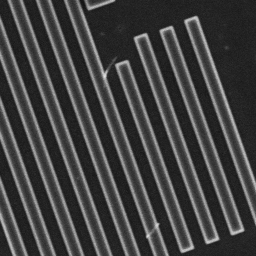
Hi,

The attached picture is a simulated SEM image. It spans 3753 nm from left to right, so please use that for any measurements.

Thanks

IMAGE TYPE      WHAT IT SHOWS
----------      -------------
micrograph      groups of lines, slits or small figures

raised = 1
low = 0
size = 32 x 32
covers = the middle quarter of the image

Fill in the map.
11000011100001110000111000011100
11100011110001110000111100011110
11100001110000111000011100001110
11100001110000111000011100001110
11100001111000111100001110000111
01110000111000011100001110000111
01110000111000011100001110000111
01111000011100001110000111000011
00111000011100001110000111000011
00111000011100001111000111000011
00011100001110000111000011100001
00011100001110000111000011100001
00011100001110000111000011110001
00001110000111000011100001110000
00001110000111000011100001110000
00001110000111000011110000111000
10000111000011100001110000111000
10000111000011100001110000111000
10000111000001110000111000011100
11000011100001110000111000011100
11000011100001110000111000011100
11100011110001110000111100011110
11100001110000111000011100001110
11100001110000111000011100001110
11100001111000111100001110000111
01110000111000011100001110000111
01110000111000011100001110000111
01111000011100001110000111000011
00111000011100001110000111000011
00111000011100001111000111000011
00011100001110000111000011100001
00011100001110000111000011100001